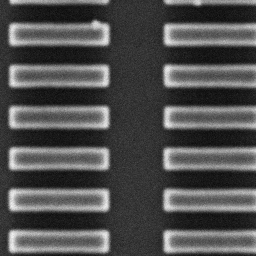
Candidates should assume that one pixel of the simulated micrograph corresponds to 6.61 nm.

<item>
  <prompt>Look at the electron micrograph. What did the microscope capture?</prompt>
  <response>groups of lines, slits or small figures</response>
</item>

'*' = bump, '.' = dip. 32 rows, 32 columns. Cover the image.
................................
................................
................................
..***********........***********
.************........***********
................................
................................
................................
..***********........***********
.************........***********
..***********........***********
................................
................................
................................
.************........***********
..***********........***********
................................
................................
................................
.************........***********
.************........***********
................................
................................
................................
.************........***********
.************........***********
................................
................................
................................
.************........***********
.************........***********
................................